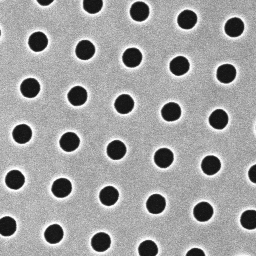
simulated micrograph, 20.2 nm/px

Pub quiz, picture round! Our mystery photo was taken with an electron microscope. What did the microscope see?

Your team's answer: a regular array of holes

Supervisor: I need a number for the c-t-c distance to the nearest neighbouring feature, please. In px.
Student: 46.6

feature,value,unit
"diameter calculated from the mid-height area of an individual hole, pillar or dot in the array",0.402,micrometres